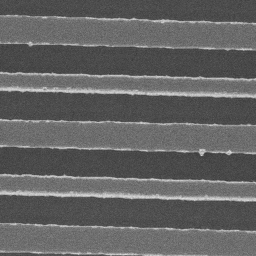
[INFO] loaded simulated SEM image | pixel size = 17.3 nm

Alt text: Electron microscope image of lines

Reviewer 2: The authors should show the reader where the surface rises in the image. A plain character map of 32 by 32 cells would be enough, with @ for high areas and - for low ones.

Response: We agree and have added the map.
--------------------------------
--------------------------------
@@@@@@@@@@@@@@@@@@@-@-----------
@@@@@@@@@@@@@@@@@@@@@@@@@@@@@@@@
@@@@@@@@@@@@@@@@@@@@@@@@@@@@@@@@
---@----@@@@@@@@@@@@@@@@@@@@@@@@
--------------------------------
--------------------------------
--------------------------------
@@@@@@@@@@@@@@@@@---------------
@@@@@@@@@@@@@@@@@@@@@@@@@@@@@@@@
--------@@@@@@@@@@@@@@@@@@@@@@@@
--------------------------------
--------------------------------
--------------------------------
@@@@@@@@@@@@@@@@@@@@@@@@@-------
@@@@@@@@@@@@@@@@@@@@@@@@@@@@@@@@
@@@@@@@@@@@@@@@@@@@@@@@@@@@@@@@@
----------@@@@@@@@@@@@@@@@@@@@@@
--------------------------------
--------------------------------
--------------------------------
@@@@@@@@@@@@@@@@@@@@@-----------
@@@@@@@@@@@@@@@@@@@@@@@@@@@@@@@@
-------@@@@@@@@@@@@@@@@@@@@@@@@@
--------------------------------
--------------------------------
--------------------------------
@@@@@@@@@@@@@@@@@@--------------
@@@@@@@@@@@@@@@@@@@@@@@@@@@@@@@@
@@@@@@@@@@@@@@@@@@@@@@@@@@@@@@@@
----@@@@@@@@@@@@@@@@@@@@@@@@@@@@